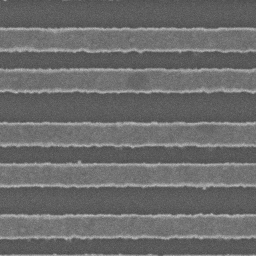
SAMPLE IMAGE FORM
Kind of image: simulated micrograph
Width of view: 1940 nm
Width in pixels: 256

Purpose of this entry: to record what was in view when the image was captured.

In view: lines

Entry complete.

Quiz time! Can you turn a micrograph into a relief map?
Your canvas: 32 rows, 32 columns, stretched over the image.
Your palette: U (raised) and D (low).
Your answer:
DDDDDDDDDDDDDDDDDDDDDDDDDDDDDDDD
DDDDDDDDDDDDDDDDDDDDDDDDDDDDDDDD
DDDDDDDDDDDDDDDDDDDDDDDDDDDDDDDD
DDDDDDDDDDDDDDDDDDDDDDDDDDDDDDDD
UUUUUUUUUUUUUUUUUUUUUUUUUUUUUUUU
UUUUUUUUUUUUUUUUUUUUUUUUUUUUUUUU
DDDDDDDDDDDUDDDDDDDDDDDDDDDDUDDD
DDDDDDDDDDDDDDDDDDDDDDDDDDDDDDDD
DDDDDDDDDDDDDDDDDDDDDDDDDDDDDDDD
UUUUUUUUUUUUUUUUUUUUUUUUUUUUUUUU
UUUUUUUUUUUUUUUUUUUUUUUUUUUUUUUU
DDDDDDDDDDDDUUDDDDDDDUUDDDDDDDDD
DDDDDDDDDDDDDDDDDDDDDDDDDDDDDDDD
DDDDDDDDDDDDDDDDDDDDDDDDDDDDDDDD
DDDDDDDDDDDDDDDDDDDDDDDDDDDDDDDD
UUUUUUUUUUUUDDUUUUUUUUUUUUUUUUUU
UUUUUUUUUUUUUUUUUUUUUUUUUUUUUUUU
UUUUUUUUUUUUUUUUUUUUUUUUUUUUUUUU
DDDDDDDDDDDDDDDDDDDDDDDDDDDDDDDD
DDDDDDDDDDDDDDDDDDDDDDDDDDDDDDDD
DDDDDDDDDDDDDDDDDDDDDDDDDDDDDDDD
UUUUUUUUUUUUUUUUUUUUUUUUUUUUUUUU
UUUUUUUUUUUUUUUUUUUUUUUUUUUUUUUU
DDDDDDDDDDDDDDDDDDDDDDDDDDDDDDDD
DDDDDDDDDDDDDDDDDDDDDDDDDDDDDDDD
DDDDDDDDDDDDDDDDDDDDDDDDDDDDDDDD
DDDDDDDDDDDDDDDDDDDDDDDDDDDDDDDD
UUUUUUUUUUUUUUUUUUUUUUUUUUUUUUUU
UUUUUUUUUUUUUUUUUUUUUUUUUUUUUUUU
UUUUUUUUUUUUUUUUUUUUUUUUUUUUUUUU
DDDDDDDDDDDDDDDDDDDDDDDDDDDDDDDD
DDDDDDDDDDDDDDDDDDDDDDDDDDDDDDDD